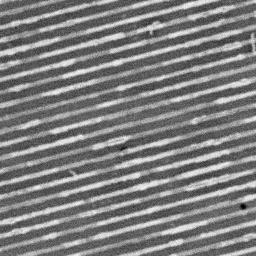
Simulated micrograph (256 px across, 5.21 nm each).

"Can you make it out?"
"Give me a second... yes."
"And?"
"parallel lines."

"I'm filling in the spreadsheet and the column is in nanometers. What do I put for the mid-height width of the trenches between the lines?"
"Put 49.2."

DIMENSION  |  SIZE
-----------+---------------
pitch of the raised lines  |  12.6 px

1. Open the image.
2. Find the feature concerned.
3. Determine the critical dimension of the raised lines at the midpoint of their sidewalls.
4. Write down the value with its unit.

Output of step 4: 0.0152 um